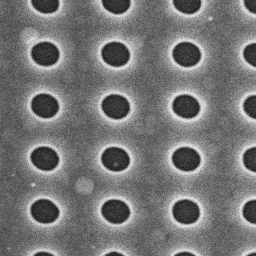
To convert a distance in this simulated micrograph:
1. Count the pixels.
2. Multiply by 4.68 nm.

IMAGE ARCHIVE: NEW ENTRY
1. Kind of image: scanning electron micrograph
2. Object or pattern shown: a regular array of holes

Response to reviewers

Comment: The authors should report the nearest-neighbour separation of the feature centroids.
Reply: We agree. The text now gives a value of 246 nm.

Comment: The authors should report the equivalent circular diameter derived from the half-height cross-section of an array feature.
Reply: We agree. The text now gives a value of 132 nanometers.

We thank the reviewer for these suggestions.